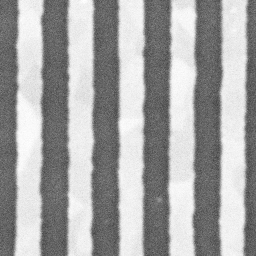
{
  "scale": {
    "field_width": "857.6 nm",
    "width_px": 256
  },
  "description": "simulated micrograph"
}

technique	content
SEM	lines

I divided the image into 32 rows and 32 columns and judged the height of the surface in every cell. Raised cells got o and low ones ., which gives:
..ooo....ooo...ooo....oo....ooo.
..ooo....ooo...ooo....oo....ooo.
..ooo....oo....ooo....oo....ooo.
..ooo....oo....ooo...ooo....ooo.
..ooo....oo....ooo....oo....ooo.
..ooo....oo....ooo....oo....ooo.
..ooo....oo....ooo...ooo....ooo.
..ooo....ooo...ooo....oo....ooo.
..ooo....oo....ooo...ooo....ooo.
..ooo....oo....ooo...ooo....ooo.
..ooo....oo....ooo...ooo....ooo.
..ooo....ooo...ooo...ooo....ooo.
..ooo....ooo...ooo...ooo....ooo.
..ooo....oo....ooo...ooo....ooo.
..ooo....oo....ooo...ooo....oo..
..ooo....oo....ooo...ooo....oo..
..ooo....oo....ooo...ooo....oo..
..ooo....ooo...ooo...ooo....oo..
..ooo....oo....ooo...ooo....oo..
..ooo....oo....ooo...ooo....oo..
..ooo....oo....ooo...ooo....ooo.
..ooo....oo....ooo...ooo....ooo.
..ooo....oo....ooo...ooo....oo..
..ooo....oo....ooo...ooo....oo..
..ooo....oo....ooo...ooo....oo..
..ooo....oo....ooo...ooo....oo..
..ooo....oo....ooo...ooo....oo..
..ooo....oo....ooo...ooo....oo..
..ooo....oo....ooo...ooo....oo..
..ooo....oo....ooo...ooo....oo..
..ooo....oo....ooo...ooo....oo..
..ooo....oo....ooo...ooo....oo..